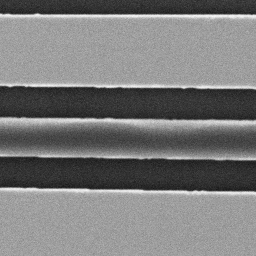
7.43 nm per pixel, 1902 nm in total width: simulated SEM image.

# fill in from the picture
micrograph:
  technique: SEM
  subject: lines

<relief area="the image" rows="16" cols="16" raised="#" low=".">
................
################
################
################
################
...............#
................
#..#####........
################
################
................
................
################
################
################
################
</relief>